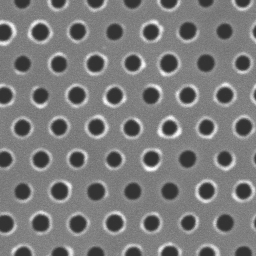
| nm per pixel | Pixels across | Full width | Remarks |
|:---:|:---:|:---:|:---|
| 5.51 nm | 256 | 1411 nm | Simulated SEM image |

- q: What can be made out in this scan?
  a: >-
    a regular array of holes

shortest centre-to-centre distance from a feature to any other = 200 nanometers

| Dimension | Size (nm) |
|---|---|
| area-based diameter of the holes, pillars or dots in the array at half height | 94.3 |